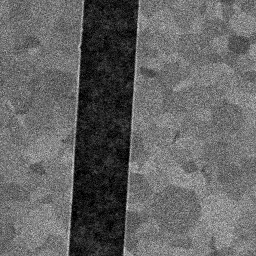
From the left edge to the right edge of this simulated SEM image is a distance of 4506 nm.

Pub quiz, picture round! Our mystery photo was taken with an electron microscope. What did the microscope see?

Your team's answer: one or a few lines or trenches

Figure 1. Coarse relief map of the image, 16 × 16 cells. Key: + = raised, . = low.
+++++....+++++++
+++++....+++++++
+++++....+++++++
+++++....+++++++
+++++...++++++++
+++++...++++++++
+++++...++++++++
+++++...++++++++
+++++...++++++++
+++++...++++++++
+++++...++++++++
+++++...++++++++
++++....++++++++
++++....++++++++
++++....++++++++
++++....++++++++